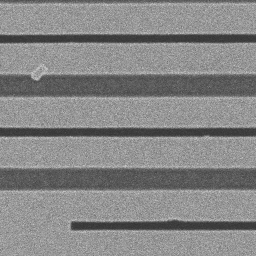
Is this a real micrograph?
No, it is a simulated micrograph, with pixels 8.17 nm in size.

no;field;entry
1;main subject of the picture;parallel lines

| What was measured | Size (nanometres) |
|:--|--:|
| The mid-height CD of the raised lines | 273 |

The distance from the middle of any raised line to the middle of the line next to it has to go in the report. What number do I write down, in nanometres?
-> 376